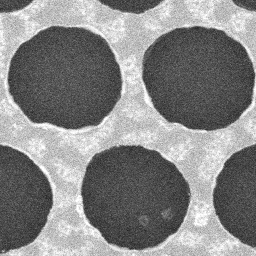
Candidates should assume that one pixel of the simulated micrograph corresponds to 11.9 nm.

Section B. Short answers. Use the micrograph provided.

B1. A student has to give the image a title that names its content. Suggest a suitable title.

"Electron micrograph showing holes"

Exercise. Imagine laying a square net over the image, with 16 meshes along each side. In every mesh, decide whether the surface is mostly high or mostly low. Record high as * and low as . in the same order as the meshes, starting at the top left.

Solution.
..*****...*****.
****************
**.....***.....*
*......**.......
*.......*.......
........*.......
*......***......
**....****.....*
****************
.*****....*****.
..***......***..
...**.......*...
...**.......*...
...**.......**..
...***.....***..
.******...******